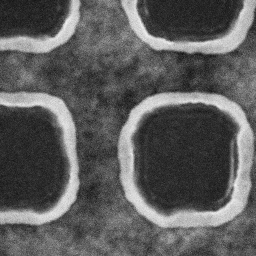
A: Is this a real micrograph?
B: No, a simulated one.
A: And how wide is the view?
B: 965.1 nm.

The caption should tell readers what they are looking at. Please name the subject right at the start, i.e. raised bodies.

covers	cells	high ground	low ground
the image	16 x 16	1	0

1111100011111111
1111000011111110
1111000001111100
0000000000000000
0000000000000000
0000000000000000
1110000001111100
1111000011111110
1111000011111110
1111100011111110
1111100011111110
1111100011111110
1111000001111110
1110000000111100
0000000000000000
0000000000000000